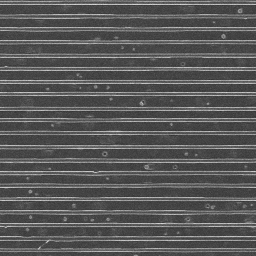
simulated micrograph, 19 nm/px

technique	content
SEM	parallel lines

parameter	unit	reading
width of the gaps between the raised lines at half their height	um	0.183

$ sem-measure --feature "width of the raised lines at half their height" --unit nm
64.2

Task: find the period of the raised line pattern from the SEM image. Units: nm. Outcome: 248